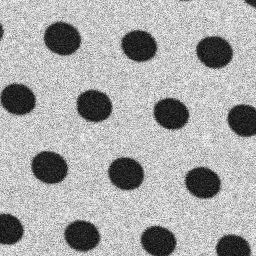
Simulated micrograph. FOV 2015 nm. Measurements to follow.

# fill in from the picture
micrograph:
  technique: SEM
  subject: a regular array of holes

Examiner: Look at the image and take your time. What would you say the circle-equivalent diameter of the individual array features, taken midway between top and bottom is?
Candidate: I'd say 270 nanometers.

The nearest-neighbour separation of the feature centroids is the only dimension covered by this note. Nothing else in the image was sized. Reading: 590 nanometers